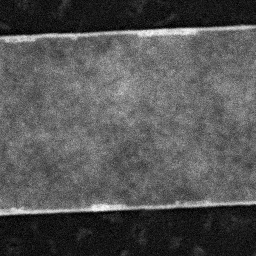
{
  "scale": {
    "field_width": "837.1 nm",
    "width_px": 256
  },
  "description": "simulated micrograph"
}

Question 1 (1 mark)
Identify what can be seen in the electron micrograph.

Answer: one or a few lines or trenches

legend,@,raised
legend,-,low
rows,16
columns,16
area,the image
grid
----------------
----------------
@@@@@@@@@@@@@@@@
@@@@@@@@@@@@@@@@
@@@@@@@@@@@@@@@@
@@@@@@@@@@@@@@@@
@@@@@@@@@@@@@@@@
@@@@@@@@@@@@@@@@
@@@@@@@@@@@@@@@@
@@@@@@@@@@@@@@@@
@@@@@@@@@@@@@@@@
@@@@@@@@@@@@@@@@
@@@@@@@@@@@@@@@@
----------------
----------------
----------------